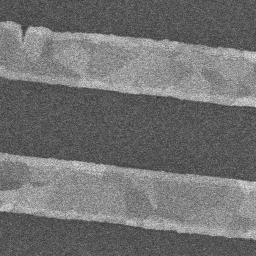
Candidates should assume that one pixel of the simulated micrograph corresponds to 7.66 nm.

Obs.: one or a few lines or trenches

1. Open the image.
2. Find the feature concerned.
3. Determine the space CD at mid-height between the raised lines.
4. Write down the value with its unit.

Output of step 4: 623 nm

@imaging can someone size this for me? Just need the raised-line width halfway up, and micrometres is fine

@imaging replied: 0.382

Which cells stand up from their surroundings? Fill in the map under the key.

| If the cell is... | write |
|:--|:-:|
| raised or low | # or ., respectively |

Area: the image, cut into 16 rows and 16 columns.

................
................
########........
################
################
.......#########
................
................
................
................
######..........
###############.
################
.....###########
.............###
................